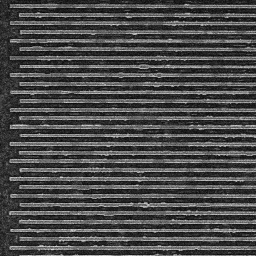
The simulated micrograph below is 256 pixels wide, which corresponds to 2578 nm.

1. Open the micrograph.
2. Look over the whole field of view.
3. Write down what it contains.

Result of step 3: parallel lines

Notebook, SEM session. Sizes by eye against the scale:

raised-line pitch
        87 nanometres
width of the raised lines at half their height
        36.5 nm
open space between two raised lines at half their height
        54.1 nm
